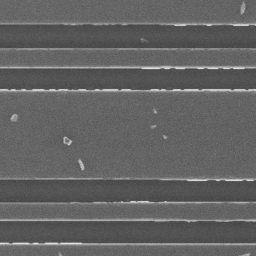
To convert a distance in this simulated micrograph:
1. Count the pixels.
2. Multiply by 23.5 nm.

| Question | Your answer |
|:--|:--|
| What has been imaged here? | lines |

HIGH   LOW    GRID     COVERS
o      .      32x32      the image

oooooooooooooooooooooooooooooooo
oooooooooooooooooooooooooooooooo
oooooooooooooooooooooooooooooooo
................................
................................
................................
oooooooooooooooooooooooooooooooo
oooooooooooooooooooooooooooooooo
................................
................................
................................
oooooooooooooooooooooooooooooooo
oooooooooooooooooooooooooooooooo
oooooooooooooooooooooooooooooooo
oooooooooooooooooooooooooooooooo
oooooooooooooooooooooooooooooooo
oooooooooooooooooooooooooooooooo
oooooooooooooooooooooooooooooooo
oooooooooooooooooooooooooooooooo
oooooooooooooooooooooooooooooooo
oooooooooooooooooooooooooooooooo
oooooooooooooooooooooooooooooooo
................................
................................
................................
oooooooooooooooooooooooooooooooo
oooooooooooooooooooooooooooooooo
oooooooooooooooooooooooooooooooo
................................
................................
................................
oooooooooooooooooooooooooooooooo